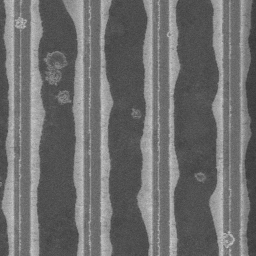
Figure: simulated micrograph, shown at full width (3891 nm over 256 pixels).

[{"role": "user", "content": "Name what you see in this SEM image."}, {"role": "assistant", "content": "lines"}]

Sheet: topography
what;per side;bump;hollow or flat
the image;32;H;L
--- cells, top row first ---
LHHHLLLLLHHHHLLLLLLHHHLLLLLHHHHL
LHHHLLLLLLHHHLLLLLLHHLLLLLLHHHHL
LHHHLLLLLLHHHLLLLLLHHLLLLLLHHHHL
LHHHLLLLLLHHHLLLLLLHHHLLLLLHHHHL
LHHHLLLLLLHHHLLLLLLHHHLLLLLHHHHL
LHHHLLLLLLHHHLLLLLLHHHLLLLLHHHHL
LHHHLLLLLLHHHLLLLLLHHHLLLLLHHHHL
LHHHLLLLLLHHHLLLLLLHHHLLLLLHHHHL
LHHHLLLLLLHHHLLLLLLHHHLLLLLLHHHL
LHHHLLLLLLHHHLLLLLLHHHLLLLLLHHLL
LLHHLLLLLLHHHLLLLLLHHLLLLLLLHHLL
LLHHLLLLLLHHHLLLLLLHHLLLLLLLHHLL
LLHHLLLLLLHHHLLLLLLHHLLLLLLHHHLL
LLHHHLLLLLHHHLLLLLLHHLLLLLLHHHLL
LLHHHLLLLLHHHLLLLLLHHLLLLLLHHHHL
LLHHLLLLLLHHHLLLLLLHHLLLLLLLHHHL
LHHHLLLLLLHHHLLLLLLHHLLLLLLLHHHL
LHHHLLLLLLHHHLLLLLHHHLLLLLLLHHHL
LHHHLLLLLLHHHLLLLLHHHLLLLLLLHHLL
LHHHLLLLLLHHHLLLLLLHHHLLLLLLHHLL
LHHHLLLLLLHHHLLLLLLHHHLLLLLLHHLL
LHHHLLLLLLHHHLLLLLLHHHLLLLLLHHLL
LHHHLLLLLLHHHLLLLLLHHHLLLLLLHHLL
LHHHLLLLLLHHHLLLLLHHHHLLLLLHHHLL
LHHHLLLLLLHHHLLLLLHHHLLLLLLHHHHL
LHHHLLLLLLHHHLLLLLHHHLLLLLLHHHHL
LHHHLLLLLLHHHLLLLLHHHLLLLLLHHHHL
LHHHLLLLLLHHHLLLLLLHHHLLLLLHHHLL
LHHHLLLLLLHHHLLLLLLHHHLLLLLHHHLL
LHHHLLLLLLHHHLLLLLLHHHLLLLLLHHLL
LLHHLLLLLLHHHLLLLLLHHHLLLLLLHHLL
LLHHLLLLLLHHHLLLLLLHHHLLLLLLHHHL